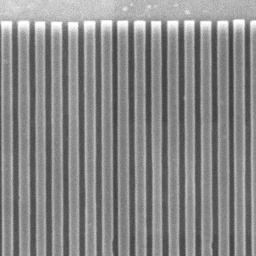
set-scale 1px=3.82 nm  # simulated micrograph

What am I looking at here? parallel lines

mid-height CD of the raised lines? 39.7 nm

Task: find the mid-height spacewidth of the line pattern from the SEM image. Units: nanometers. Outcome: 25.3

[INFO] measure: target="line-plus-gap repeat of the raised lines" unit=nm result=63.5